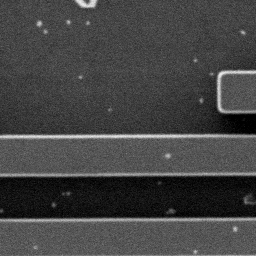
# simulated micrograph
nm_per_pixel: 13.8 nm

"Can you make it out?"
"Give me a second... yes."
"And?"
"groups of lines, slits or small figures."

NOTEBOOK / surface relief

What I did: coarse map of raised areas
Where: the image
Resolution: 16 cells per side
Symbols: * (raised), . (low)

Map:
................
................
................
................
...............*
..............**
..............**
................
................
****************
****************
................
................
................
****************
****************